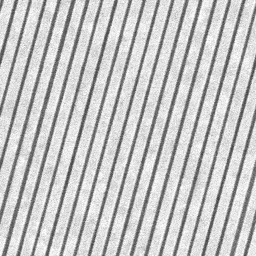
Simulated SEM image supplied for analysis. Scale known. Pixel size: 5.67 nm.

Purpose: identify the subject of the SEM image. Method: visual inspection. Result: parallel lines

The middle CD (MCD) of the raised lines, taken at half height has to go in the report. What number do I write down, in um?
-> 0.0506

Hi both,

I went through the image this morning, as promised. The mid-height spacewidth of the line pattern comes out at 25.3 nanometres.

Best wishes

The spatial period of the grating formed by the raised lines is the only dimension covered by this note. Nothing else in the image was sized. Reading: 77.7 nanometres